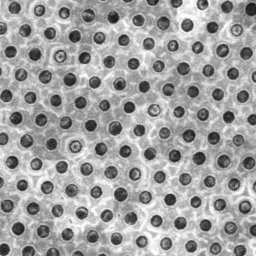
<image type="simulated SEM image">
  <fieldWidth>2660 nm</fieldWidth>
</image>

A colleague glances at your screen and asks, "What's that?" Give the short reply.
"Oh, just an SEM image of a regular array of holes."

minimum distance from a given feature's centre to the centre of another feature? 255 nm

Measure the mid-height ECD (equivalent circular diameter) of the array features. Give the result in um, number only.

0.14